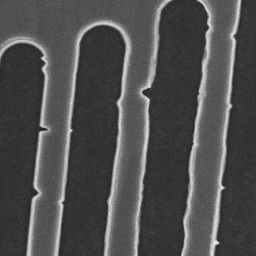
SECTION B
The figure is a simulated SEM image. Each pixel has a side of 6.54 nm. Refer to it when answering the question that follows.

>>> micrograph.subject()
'one or a few lines or trenches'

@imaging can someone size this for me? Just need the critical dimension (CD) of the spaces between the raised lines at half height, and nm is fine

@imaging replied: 310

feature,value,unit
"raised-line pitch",509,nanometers